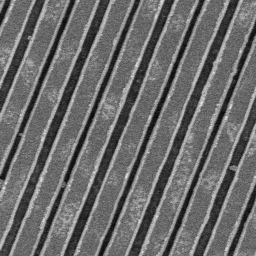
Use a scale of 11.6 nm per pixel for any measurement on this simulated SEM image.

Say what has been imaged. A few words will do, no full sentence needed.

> parallel lines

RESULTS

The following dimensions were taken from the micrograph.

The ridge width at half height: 232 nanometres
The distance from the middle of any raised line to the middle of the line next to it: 348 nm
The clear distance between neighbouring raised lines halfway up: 125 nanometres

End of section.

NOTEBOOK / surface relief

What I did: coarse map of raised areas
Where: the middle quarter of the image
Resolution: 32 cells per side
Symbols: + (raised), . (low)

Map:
++...++++++..+++++....+++++..+++
++...+++++...+++++...++++++..+++
+....+++++..+++++....+++++..++++
+...+++++...+++++...++++++..++++
....+++++..++++++...+++++...++++
...++++++..+++++....+++++..+++++
...+++++...+++++...++++++..+++++
...+++++..+++++....+++++..+++++.
..++++++..+++++....+++++..+++++.
..+++++..++++++...+++++...+++++.
..+++++..+++++....+++++..+++++..
.+++++...+++++...+++++...+++++..
.+++++..+++++....+++++..+++++...
++++++..+++++....+++++..+++++...
+++++..++++++...+++++..++++++...
+++++..+++++....+++++..+++++....
++++...+++++...+++++...+++++...+
++++..+++++....+++++..++++++...+
+++...+++++...++++++..+++++....+
+++...+++++...+++++..++++++...++
+++..+++++....+++++..++++++...++
++...+++++...+++++...+++++...+++
++..+++++....+++++..++++++...+++
+...+++++...++++++..+++++....+++
+..++++++...+++++...+++++...++++
+..+++++....+++++..+++++....++++
..++++++...+++++...+++++....++++
..++++++...+++++..++++++...+++++
..+++++...++++++..+++++....+++++
.++++++...+++++...+++++...++++++
.+++++....+++++..+++++....+++++.
.+++++...+++++...+++++...++++++.